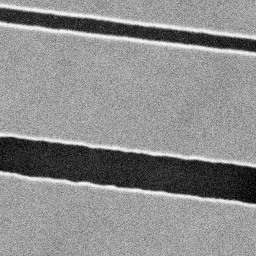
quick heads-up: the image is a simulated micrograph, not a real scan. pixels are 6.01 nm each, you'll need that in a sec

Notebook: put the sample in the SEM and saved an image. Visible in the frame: lines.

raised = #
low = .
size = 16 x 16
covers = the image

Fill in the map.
################
################
################
################
################
################
################
################
################
........########
................
######..........
##############..
################
################
################